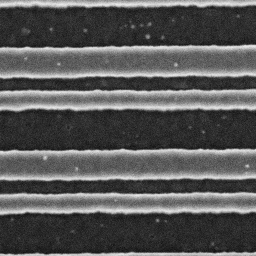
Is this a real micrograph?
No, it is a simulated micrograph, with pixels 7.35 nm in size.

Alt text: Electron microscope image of lines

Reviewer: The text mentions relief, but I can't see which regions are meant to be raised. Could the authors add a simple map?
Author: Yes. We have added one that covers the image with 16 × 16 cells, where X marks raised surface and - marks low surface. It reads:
----------------
----------------
----------------
XXXXXXXXXXXXXXXX
XXXXXXXXXXXXXXXX
XXXXXXXXXXXXXXXX
XXXXXXXXXXXXXXXX
----------------
----------------
XXXXXXXXXXXXXXXX
XXXXXXXXXXXXXXXX
XXXXXXXXXXXXXXXX
XXXXXXXXXXXXXXXX
----------------
----------------
----------------